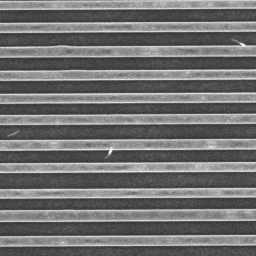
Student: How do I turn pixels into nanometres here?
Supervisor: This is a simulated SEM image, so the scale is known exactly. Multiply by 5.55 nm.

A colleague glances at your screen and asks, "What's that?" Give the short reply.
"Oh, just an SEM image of parallel lines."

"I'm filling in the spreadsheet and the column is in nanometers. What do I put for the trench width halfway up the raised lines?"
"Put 76.3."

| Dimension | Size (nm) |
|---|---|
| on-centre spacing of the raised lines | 131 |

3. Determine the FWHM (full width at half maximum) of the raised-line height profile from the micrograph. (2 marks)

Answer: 0.0555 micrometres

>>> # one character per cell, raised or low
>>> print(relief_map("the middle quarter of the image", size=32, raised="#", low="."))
................................
................................
################################
################################
................................
................................
................................
################################
################################
################################
................................
................................
................................
################################
################################
................................
................................
................................
................................
################################
################################
...........#....................
................................
................................
................................
################################
################################
................................
................................
................................
................................
################################